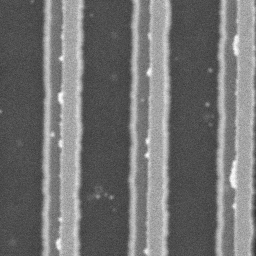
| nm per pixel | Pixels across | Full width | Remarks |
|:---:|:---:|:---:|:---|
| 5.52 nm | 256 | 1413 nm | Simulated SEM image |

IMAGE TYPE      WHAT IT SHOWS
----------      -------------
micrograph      lines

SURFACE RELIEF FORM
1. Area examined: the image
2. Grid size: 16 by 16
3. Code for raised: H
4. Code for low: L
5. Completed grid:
LLLHHLLLLHLLLLHH
LLLHHLLLHHLLLLHH
LLLHHLLLHHLLLLHH
LLLHHLLLHHLLLLHH
LLLHHLLLHHLLLLHH
LLLHHLLLHHLLLLHH
LLLHHLLLHHLLLLHH
LLLHHLLLHHLLLLHH
LLLHHLLLHHLLLLHH
LLLHHLLLHHLLLLHH
LLLHHLLLHHLLLLHH
LLLHHLLLHHLLLLHH
LLLHHLLLHHLLLLHH
LLLHHLLLHHLLLLHH
LLLHHLLLHHLLLLHH
LLLHHLLLHHLLLLHH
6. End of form